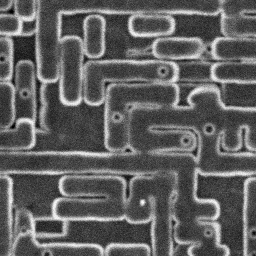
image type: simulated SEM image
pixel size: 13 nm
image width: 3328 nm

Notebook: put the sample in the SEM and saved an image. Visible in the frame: wiring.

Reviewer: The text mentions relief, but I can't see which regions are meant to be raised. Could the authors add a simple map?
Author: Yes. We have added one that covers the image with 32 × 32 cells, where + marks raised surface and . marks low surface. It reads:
++++++++++++++++++++++++++++++++
+.++++++++++++++++++++++++++++++
+++..+++...++...++++++......++++
+++..+++...++...++++++......++++
+....+++..+++......++.......++++
+....++++++++......++++++..+++++
+....++++++++......++++++..+++++
+....++++++++......+++.....+++++
+....+++++++++++++++++.....+++++
+....+++++++++++++++++.....+++++
+.......++++++++++++++..........
++......++++++++++++++..+++.....
++......++++++++++++++..++++....
++...........+++++++++++++++++..
++...........+++++++++++++++++++
++++.........+++++++++++++++++++
++++.........+++++++++++++++++.+
++++.........+++++++++++++++++++
++++.........+++++++++++++++++.+
++++++++++++++++++++++++++++++++
++++++++++++++++++++++++++++++++
++++++++++++++++++++++++++++++++
+.......+++++++.+++++++++......+
+.......+++++++++++++++++......+
+.......+++++++++++++++++......+
+......++++++++++++++++++++....+
+......++++++++++++++++++++...++
+.++............+++++++++++...++
++++...............++++++++....+
++++...............++++++++....+
+++++..............+++.+++++...+
++++++++++++++++++++++..+++++..+